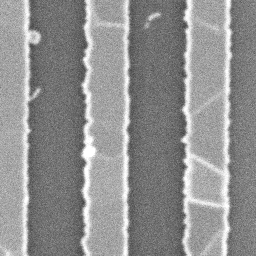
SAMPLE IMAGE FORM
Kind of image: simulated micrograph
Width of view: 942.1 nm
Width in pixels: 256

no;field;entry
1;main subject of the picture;lines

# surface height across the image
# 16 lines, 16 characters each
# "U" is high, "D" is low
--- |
UUDDDUUUDDDDUUDD
UUDDDUUUDDDDUUDD
UUDDDUUUDDDDUUDD
UUDDDUUUDDDDUUDD
UUDDDUUUDDDDUUDD
UUDDDUUUDDDDUUDD
UUDDDUUUDDDDUUDD
UUDDDUUUDDDDUUDD
UUDDDUUUDDDDUUDD
UUDDDUUUDDDDUUDD
UUDDDUUUDDDDUUDD
UUDDDUUUDDDDUUDD
UUDDDUUUDDDDUUDD
UUDDDUUUDDDDUUDD
UUDDDUUUDDDDUUDD
UUDDDUUUDDDDUUDD